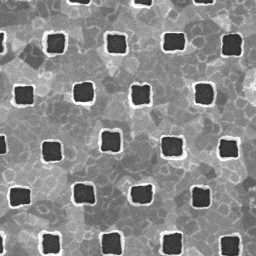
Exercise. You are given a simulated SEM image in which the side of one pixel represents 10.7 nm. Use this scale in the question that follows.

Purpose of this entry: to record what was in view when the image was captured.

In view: a regular array of holes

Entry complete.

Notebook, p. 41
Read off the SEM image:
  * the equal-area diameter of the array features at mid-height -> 0.241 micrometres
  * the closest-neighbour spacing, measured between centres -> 596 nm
